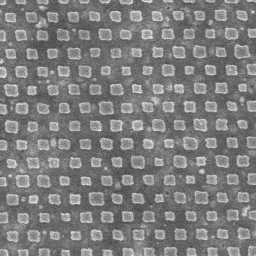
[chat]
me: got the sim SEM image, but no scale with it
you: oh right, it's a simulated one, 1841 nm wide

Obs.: a regular array of raised bodies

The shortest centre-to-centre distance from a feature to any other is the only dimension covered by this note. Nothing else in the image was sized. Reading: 148 nm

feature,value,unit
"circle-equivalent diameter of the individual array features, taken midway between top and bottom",78.7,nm